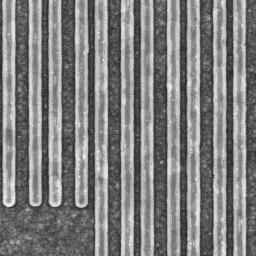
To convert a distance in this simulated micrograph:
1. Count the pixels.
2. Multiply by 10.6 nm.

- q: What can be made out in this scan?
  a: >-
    parallel lines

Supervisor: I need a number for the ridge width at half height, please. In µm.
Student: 0.104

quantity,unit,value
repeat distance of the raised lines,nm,245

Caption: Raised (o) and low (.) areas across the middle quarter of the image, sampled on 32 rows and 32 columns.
...oo...oo.....oo...oo....oo...o
...ooo..oo.....oo...oo....oo...o
...ooo..oo.....oo...oo....oo...o
...oo...oo.....oo...oo....oo...o
...oo...oo.....oo...oo....oo...o
...oo...oo.....oo...oo....oo...o
...oo...oo.....oo...oo....oo...o
...oo...oo.....oo...oo....oo...o
...oo...oo.....oo...oo....oo...o
...oo...oo.....oo...oo....oo...o
...ooo..oo.....oo...oo....oo...o
...ooo..oo.....oo...oo....oo...o
...oo...oo.....oo...oo....oo...o
...oo...oo.....oo...oo....oo...o
...oo...oo.....oo...oo....oo...o
...oo...oo.....oo...oo....oo...o
...oo...oo.....oo...oo....oo...o
...ooo..oo.....oo...oo....oo...o
...ooo..oo.....oo...oo....oo...o
...oo...oo.....oo...oo....oo...o
...ooo..oo.....oo...oo....oo...o
...oo...oo.....oo...oo....oo...o
...oo...oo.....oo...oo....oo...o
...oo...oo.....oo...oo....oo...o
...oo...oo.....oo...oo....oo...o
...oo...oo.....oo...oo....oo...o
...oo...oo.....oo...oo....oo...o
...oo...oo.....oo...oo....oo...o
...oo...oo.....oo...oo....oo...o
...oo...oo.....oo...oo....oo...o
...oo...oo.....oo...oo....oo...o
...oo...oo.....oo...oo....oo...o